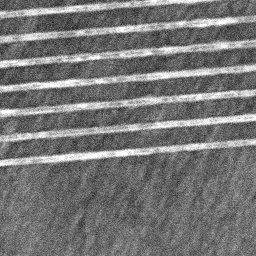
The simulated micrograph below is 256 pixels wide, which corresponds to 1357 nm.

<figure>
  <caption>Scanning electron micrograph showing parallel lines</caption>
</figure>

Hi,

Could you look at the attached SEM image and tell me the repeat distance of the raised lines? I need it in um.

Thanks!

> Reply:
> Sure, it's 0.131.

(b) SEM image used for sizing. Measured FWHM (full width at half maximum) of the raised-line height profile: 25.1 nm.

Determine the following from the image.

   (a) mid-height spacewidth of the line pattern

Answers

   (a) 19.7 pixels